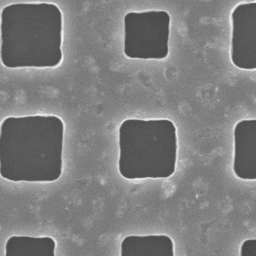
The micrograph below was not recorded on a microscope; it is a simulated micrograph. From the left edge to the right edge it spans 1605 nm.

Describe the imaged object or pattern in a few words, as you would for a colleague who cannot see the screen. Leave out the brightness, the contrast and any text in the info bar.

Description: holes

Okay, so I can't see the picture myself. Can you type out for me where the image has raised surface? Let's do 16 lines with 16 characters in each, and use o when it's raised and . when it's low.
....ooooooooooo.
....oooo...oooo.
....oooo..oooo..
....oooo..oooo..
oooooooooooooooo
oooooooooooooooo
oooooooooooooooo
....oooo.ooooooo
....ooo....oooo.
....ooo....oooo.
....ooo....oooo.
oooooooooooooooo
oooooooooooooooo
oooooooooooooooo
oooooooooooooooo
...ooooo...oooo.